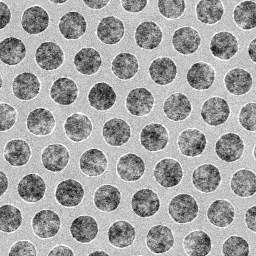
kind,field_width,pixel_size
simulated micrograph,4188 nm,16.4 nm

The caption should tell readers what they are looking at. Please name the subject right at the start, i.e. a regular array of raised bodies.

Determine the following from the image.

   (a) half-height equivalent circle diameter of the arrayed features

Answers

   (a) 471 nm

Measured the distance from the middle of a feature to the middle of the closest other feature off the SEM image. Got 621 nm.